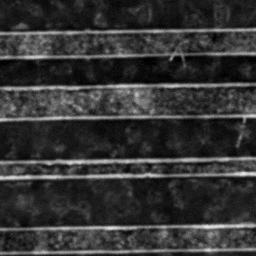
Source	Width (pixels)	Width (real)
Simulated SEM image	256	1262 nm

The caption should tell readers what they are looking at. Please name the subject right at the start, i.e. one or a few lines or trenches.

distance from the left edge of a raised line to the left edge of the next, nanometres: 321